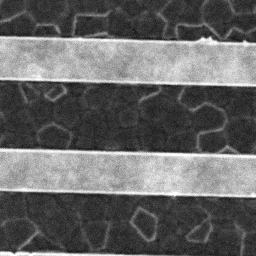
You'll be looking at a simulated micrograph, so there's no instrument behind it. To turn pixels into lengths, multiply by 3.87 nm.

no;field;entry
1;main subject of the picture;one or a few lines or trenches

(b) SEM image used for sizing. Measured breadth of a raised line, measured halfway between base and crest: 160 nm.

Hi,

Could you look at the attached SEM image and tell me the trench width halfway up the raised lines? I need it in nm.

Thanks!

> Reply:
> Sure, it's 275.